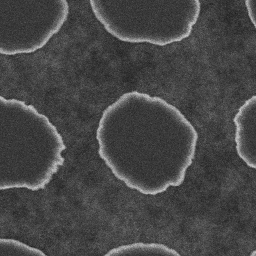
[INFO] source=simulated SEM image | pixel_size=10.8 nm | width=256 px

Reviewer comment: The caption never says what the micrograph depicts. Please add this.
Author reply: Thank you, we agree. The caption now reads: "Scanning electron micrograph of raised bodies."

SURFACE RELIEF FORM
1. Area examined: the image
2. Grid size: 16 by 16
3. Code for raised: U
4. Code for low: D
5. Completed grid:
UUUUDDUUUUUUDDDD
UUUUDDDUUUUUDDDD
UUUDDDDDUUUDDDDD
DDDDDDDDDDDDDDDD
DDDDDDDDDDDDDDDD
DDDDDDDDDDDDDDDD
UDDDDDDUUUDDDDDU
UUUDDDUUUUUUDDDU
UUUUDDUUUUUUDDDU
UUUUDDUUUUUUDDDU
UUUDDDDUUUUUDDDD
UUUDDDDDUUUDDDDD
DDDDDDDDDDDDDDDD
DDDDDDDDDDDDDDDD
DDDDDDDDDDDDDDDD
UUDDDDDDUUDDDDDD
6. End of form